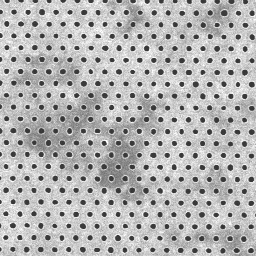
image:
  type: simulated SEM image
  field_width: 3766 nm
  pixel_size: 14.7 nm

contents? a regular array of holes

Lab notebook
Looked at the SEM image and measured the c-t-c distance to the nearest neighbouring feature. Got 199 nm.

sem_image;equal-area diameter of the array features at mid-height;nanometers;77.8